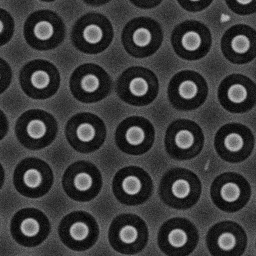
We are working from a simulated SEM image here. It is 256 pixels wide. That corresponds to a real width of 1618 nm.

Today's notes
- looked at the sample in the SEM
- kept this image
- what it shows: an array of small figures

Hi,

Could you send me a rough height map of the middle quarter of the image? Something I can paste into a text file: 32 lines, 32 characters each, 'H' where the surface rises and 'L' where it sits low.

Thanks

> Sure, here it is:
HHHHLLLLLHHHHHHHHLLHHHHHHHHHHHHH
HHLLLLLLLLHHHHHLLLLLLLHHHHHHHHLL
HHLLLLLLLLLHHHLLLLLLLLLHHHHHLLLL
HLLLLHHHLLLLHLLLLLLLLLLLHHHLLLLL
HLLLLHHHLLLLHLLLLHHHLLLLHHLLLLHH
HLLLLHHHLLLLLLLLLHHHHLLLHHLLLHHH
HHLLLHHHLLLLHLLLLHHHHLLLHHLLLHHH
HHLLLLLLLLLHHLLLLHHHLLLLHHLLLHHH
HHHLLLLLLLHHHHLLLLLLLLLHHHLLLLHL
HHHHLLLLLHHHHHHLLLLLLLHHHHLLLLLL
HHHHHHHHHHHHHHHHHLLLHHHHHHHLLLLL
HHHHHHHHHHHHHHHHHHHHHHHHHHHHHLLL
HHHLLLLLHHHHHHHHHHHHHHHHHHHHHHHH
HHLLLLLLLHHHHHHLLLLLLHHHHHHHHHHH
HLLLLLLLLLHHHHLLLLLLLLHHHHHLLLLL
LLLLHHHLLLHHHLLLLLLLLLHHHHLLLLLL
LLLHHHHLLLLHHLLLHHHLLLLHHLLLLLLL
LLLHHHHLLLLHHLLLHHHHLLLHHLLLHHHH
LLLLHHHLLLHHHLLLHHHHLLLHHLLLHHHH
HLLLLLLLLLHHHLLLHHHLLLLHHLLLHHHH
HHLLLLLLLHHHHLLLLLLLLLHHHLLLLHHL
HHHLLLLLHHHHHHLLLLLLLLHHHLLLLLLL
HHHHHHHHHHHHHHHLLLLLHHHHHHLLLLLL
HHHHHHHHHHHHHHHHHHHHHHHHHHHLLLLL
HHLLLLLHHHHHHHHHHHHHHHHHHHHHHHHH
HLLLLLLLHHHHHHHHLLHHHHHHHHHHHHHH
LLLLLLLLLHHHHHLLLLLLHHHHHHLLLLLL
LLLLLLLLLHHHHLLLLLLLLHHHHLLLLLLL
LLLHHHHLLLHHLLLLHHLLLLHHLLLLLLLL
LLLHHHHLLLHHLLLHHHHLLLHHLLLLHHLL
LLLHHHLLLLHHLLLHHHHLLLHHLLLHHHHL
LLLLLLLLLHHHLLLHHHHLLLHLLLLHHHHL